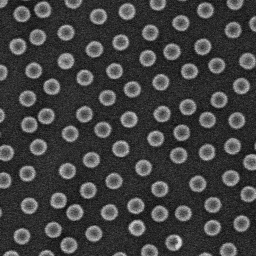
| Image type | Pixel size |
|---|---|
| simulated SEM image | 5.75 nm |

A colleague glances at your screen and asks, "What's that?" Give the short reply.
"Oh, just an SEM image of a regular array of raised bodies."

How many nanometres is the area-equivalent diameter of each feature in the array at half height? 91.8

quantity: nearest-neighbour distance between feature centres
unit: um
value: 0.146